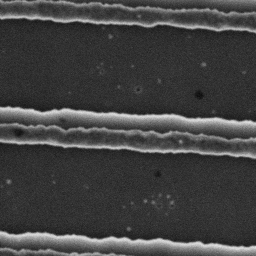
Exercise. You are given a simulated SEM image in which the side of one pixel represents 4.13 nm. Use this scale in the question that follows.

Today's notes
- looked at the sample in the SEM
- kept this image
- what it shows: lines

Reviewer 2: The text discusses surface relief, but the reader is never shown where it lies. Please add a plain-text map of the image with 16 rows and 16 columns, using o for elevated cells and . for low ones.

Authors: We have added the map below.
oooooooooooooooo
........oooooooo
................
................
................
................
................
oooooooooooooo..
oooooooooooooooo
............oooo
................
................
................
................
................
oooooooooooooooo